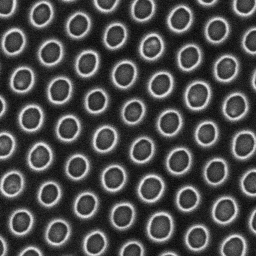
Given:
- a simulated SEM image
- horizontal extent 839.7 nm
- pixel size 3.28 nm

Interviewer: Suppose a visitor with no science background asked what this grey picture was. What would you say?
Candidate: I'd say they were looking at a regular array of holes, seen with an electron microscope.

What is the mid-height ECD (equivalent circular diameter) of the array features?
0.0688 um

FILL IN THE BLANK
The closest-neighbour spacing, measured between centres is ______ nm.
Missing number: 126